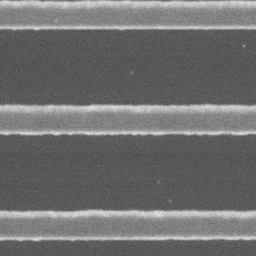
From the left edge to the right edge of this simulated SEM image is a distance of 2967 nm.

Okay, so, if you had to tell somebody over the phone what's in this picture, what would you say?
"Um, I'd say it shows lines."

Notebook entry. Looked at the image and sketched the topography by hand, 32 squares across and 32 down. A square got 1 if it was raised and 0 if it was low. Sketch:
11111110011111111111111111111111
11111111111111111111111111111111
11111111111111111111111111111111
11111111111111111111111111111111
00000000000000000000000000000000
00000000000000000000000000000000
00000000000000000000000000000000
00000000000000000000000000000000
00000000000000000000000000000000
00000000000000000000000000000000
00000000000000000000000000000000
00000000000000000000000000000000
00000000000000000000000000000000
11100010000111111110000011111110
11111111111111111111111111111111
11111111111111111111111111111111
11111111111111111111111111111111
00000000000000000000000000000000
00000000000000000000000000000000
00000000000000000000000000000000
00000000000000000000000000000000
00000000000000000000000000000000
00000000000000000000000000000000
00000000000000000000000000000000
00000000000000000000000000000000
00000000000000000000000000000000
00000000000000000000000000000000
11111111111111111111111111111111
11111111111111111111111111111111
11111111111111111111111111111111
00000000000000000000000000000000
00000000000000000000000000000000